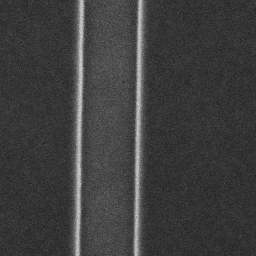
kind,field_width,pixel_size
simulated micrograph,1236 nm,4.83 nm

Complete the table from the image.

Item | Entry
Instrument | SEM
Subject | one or a few lines or trenches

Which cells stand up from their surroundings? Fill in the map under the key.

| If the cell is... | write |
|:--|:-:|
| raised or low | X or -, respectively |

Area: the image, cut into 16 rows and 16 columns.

XXXXX----XXXXXXX
XXXXX----XXXXXXX
XXXXX----XXXXXXX
XXXXX----XXXXXXX
XXXXX----XXXXXXX
XXXXX----XXXXXXX
XXXXX----XXXXXXX
XXXXX----XXXXXXX
XXXXX----XXXXXXX
XXXXX----XXXXXXX
XXXXX----XXXXXXX
XXXXX----XXXXXXX
XXXXX----XXXXXXX
XXXXX----XXXXXXX
XXXXX----XXXXXXX
XXXXX----XXXXXXX